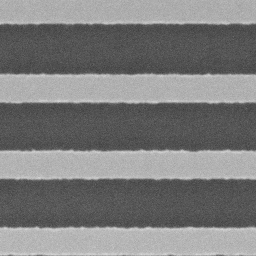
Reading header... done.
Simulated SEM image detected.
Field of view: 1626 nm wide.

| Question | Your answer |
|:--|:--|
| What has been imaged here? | lines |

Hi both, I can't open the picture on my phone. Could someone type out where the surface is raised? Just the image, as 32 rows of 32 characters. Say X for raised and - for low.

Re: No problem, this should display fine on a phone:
XXXXXXXXXXXXXXXXXXXXXXXXXXXXXXXX
XXXXXXXXXXXXXXXXXXXXXXXXXXXXXXXX
XXXXXXXXXXXXXXXXXXXXXXXXXXXXXXXX
--------------------------------
--------------------------------
--------------------------------
--------------------------------
--------------------------------
--------------------------------
XXXXXXXXXXXXXXXXXXXXXXXXXXXXXXXX
XXXXXXXXXXXXXXXXXXXXXXXXXXXXXXXX
XXXXXXXXXXXXXXXXXXXXXXXXXXXXXXXX
XXXXXXXXXXXXXXXXXXXXXXXXXXXXXXXX
--------------------------------
--------------------------------
--------------------------------
--------------------------------
--------------------------------
--------------------------------
XXXXXXXXXXXXXXXXXXXXXXXXXXXXXXXX
XXXXXXXXXXXXXXXXXXXXXXXXXXXXXXXX
XXXXXXXXXXXXXXXXXXXXXXXXXXXXXXXX
--------------------------------
--------------------------------
--------------------------------
--------------------------------
--------------------------------
--------------------------------
X-X-X---X-X-XXX---X----X--X----X
XXXXXXXXXXXXXXXXXXXXXXXXXXXXXXXX
XXXXXXXXXXXXXXXXXXXXXXXXXXXXXXXX
XXXXXXXXXXXXXXXXXXXXXXXXXXXXXXXX